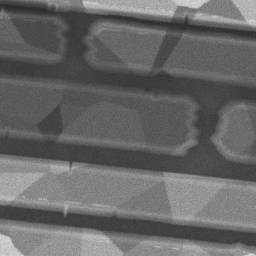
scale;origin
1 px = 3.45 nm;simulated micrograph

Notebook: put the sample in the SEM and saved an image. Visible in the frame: one or a few lines or trenches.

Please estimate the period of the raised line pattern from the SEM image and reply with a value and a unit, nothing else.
250 nanometres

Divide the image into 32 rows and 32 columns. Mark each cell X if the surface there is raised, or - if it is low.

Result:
-----XXXXXXXXXXXXXXXXXXXXXXXXXXX
X--------------XXXXXXXXXXXXXXXXX
XXXXXXXX----------------XXXXXXXX
XXXXXXXX----XXXXXX--------------
XXXXXXXX---XXXXXXXXXXXXXXX------
XXXXXXXX---XXXXXXXXXXXXXXXXXXXXX
XXXXXXXX---XXXXXXXXXXXXXXXXXXXXX
-----XX----XXXXXXXXXXXXXXXXXXXXX
-------------XXXXXXXXXXXXXXXXXXX
------------------------XXXXXXXX
XXXXXXXX------------------------
XXXXXXXXXXXXXXXX----------------
XXXXXXXXXXXXXXXXXXXXXXXX--------
XXXXXXXXXXXXXXXXXXXXXXXX----XXXX
XXXXXXXXXXXXXXXXXXXXXXXX----XXXX
XXXXXXXXXXXXXXXXXXXXXXXX----XXXX
XXXXXXXXXXXXXXXXXXXXXXXX---XXXXX
--------XXXXXXXXXXXXXXXX---XXXXX
------------------XXXXX----XXXXX
-----------------------------XXX
XXXXXXX-------------------------
XXXXXXXXXXXXXXXX----------------
XXXXXXXXXXXXXXXXXXXXXXXXXX------
XXXXXXXXXXXXXXXXXXXXXXXXXXXXXXXX
XXXXXXXXXXXXXXXXXXXXXXXXXXXXXXXX
---XXXXXXXXXXXXXXXXXXXXXXXXXXXXX
------------XXXXXXXXXXXXXXXXXXXX
----------------------XXXXXXXXXX
XXXXX--------------------------X
XXXXXXXXXXXXXX------------------
XXXXXXXXXXXXXXXXXXXXXXXX--------
XXXXXXXXXXXXXXXXXXXXXXXXXXXXXXXX